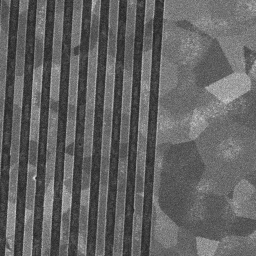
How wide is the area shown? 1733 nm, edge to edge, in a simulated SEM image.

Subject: parallel lines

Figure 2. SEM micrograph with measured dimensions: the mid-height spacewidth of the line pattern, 0.0634 µm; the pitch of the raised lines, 122 nm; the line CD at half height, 56.6 nm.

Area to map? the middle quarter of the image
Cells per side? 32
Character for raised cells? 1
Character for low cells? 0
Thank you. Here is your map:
00100011000110011000110011111111
00100011000110011001110011111111
01100011000100011001110011111111
01100011000100011001110011111111
01100011001100011001100011111111
01100011001100011001100011111111
01100011001100011001100011111111
01100011001100011001100011111111
01100011001100011001100011111111
01100011001100010001100011111111
01100011001100010001100011111111
01100011001100110001100011111111
01100010001100110001100011111111
01100010001100110001100111111111
01100110001100110001100111111111
01100110001100110001100111111111
01100110001100110001100111111111
01100110001100110001100111111111
01100110001100110001100111111111
01100110001000110011100111111111
11100110001000110011100111111111
11100110011000110011000111111111
11000110011000110011000111111111
11000110011000110011000111111111
11000110011000110011000111111111
11000110011000110011000111111111
11000110011000110011000111111111
11000110011000110011000111111111
11000110011000110011000111111111
11000100011001110011000111111111
11000100011001110011001111111111
11001100011001100011001111111111